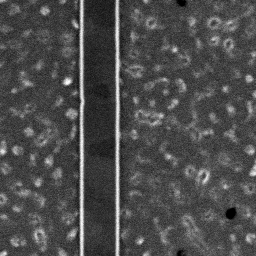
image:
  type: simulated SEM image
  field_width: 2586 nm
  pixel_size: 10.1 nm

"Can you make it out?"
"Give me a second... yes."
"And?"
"one or a few lines or trenches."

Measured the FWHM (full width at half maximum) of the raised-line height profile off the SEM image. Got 0.369 micrometres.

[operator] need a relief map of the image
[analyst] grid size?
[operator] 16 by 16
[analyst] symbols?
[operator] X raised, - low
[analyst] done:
-----XX---------
-----XX---------
-----XX---------
-----XX---------
-----XX---------
-----XX---------
-----XX---------
-----XX---------
-----XX---------
-----XX---------
-----XX---------
-----XX---------
-----XX---------
-----XX---------
-----XX---------
-----XX---------